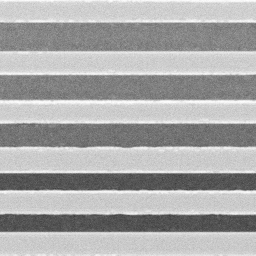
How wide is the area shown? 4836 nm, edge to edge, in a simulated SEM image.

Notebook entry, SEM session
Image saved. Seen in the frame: lines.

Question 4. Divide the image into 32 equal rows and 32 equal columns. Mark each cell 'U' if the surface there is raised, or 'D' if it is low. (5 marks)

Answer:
UUUUUUUUUUUUUUUUUUUUUUUUUUUUUUUU
UUUUUUUUUUUUUUUUUUUUUUUUUUUUUUUU
UUUUUUUUUUUUUUUUUUUUUUUUUUUUUUUU
DDDDDDDDDDDDDDDDDDDDDDDDDDDDDDDD
DDDDDDDDDDDDDDDDDDDDDDDDDDDDDDDD
DDDDDDDDDDDDDDDDDDDDDDDDDDDDDDDD
DDDDDDDDDDDDDDDDDDDDDDDDDDDDDDDD
UUUUUUUUUUUUUUUUUUUUUUUUUUUUUUUU
UUUUUUUUUUUUUUUUUUUUUUUUUUUUUUUU
DDDDDDDDDDDDDDDDDDDDDDDDDDDDDDDD
DDDDDDDDDDDDDDDDDDDDDDDDDDDDDDDD
DDDDDDDDDDDDDDDDDDDDDDDDDDDDDDDD
DDDDDDDDDDDDDDDDDDDDDDDDDDDDDDDD
UUUUUUUUUUUUUUUUUUUUUUUUUUUUUUUU
UUUUUUUUUUUUUUUUUUUUUUUUUUUUUUUU
DDDDDDDDDDDDDDDDDDDDDDDDDDDDDDDD
DDDDDDDDDDDDDDDDDDDDDDDDDDDDDDDD
DDDDDDDDDDDDDDDDDDDDDDDDDDDDDDDD
UUUUUUUUUUUUUUUDUUUUUUUUUUUUUUUU
UUUUUUUUUUUUUUUUUUUUUUUUUUUUUUUU
UUUUUUUUUUUUUUUUUUUUUUUUUUUUUUUU
UUUUUUUUUUUUUUUUUUUUUUUUUUUUUUUU
DDDDDDDDDDDDDDDDDDDDDDDDDDDDDDDD
DDDDDDDDDDDDDDDDDDDDDDDDDDDDDDDD
UUUUUUUUUUUUUUUUUUUUUUUUUUUUUUUU
UUUUUUUUUUUUUUUUUUUUUUUUUUUUUUUU
UUUUUUUUUUUUUUUUUUUUUUUUUUUUUUUU
DDDDDDDDDDDDDDDDDDDDDDDDDDDDDDDD
DDDDDDDDDDDDDDDDDDDDDDDDDDDDDDDD
UUUUUUUUUUUUUUUUUUUUUUUUUUUUUUUU
UUUUUUUUUUUUUUUUUUUUUUUUUUUUUUUU
UUUUUUUUUUUUUUUUUUUUUUUUUUUUUUUU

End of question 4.